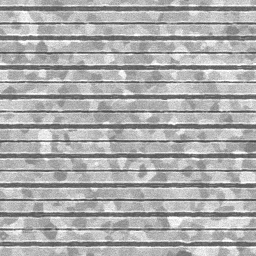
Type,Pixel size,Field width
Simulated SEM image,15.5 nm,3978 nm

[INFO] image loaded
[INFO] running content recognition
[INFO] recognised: parallel lines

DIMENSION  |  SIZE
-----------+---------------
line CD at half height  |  163 nanometres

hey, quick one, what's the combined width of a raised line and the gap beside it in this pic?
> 0.227 um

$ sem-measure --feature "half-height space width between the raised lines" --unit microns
0.0816